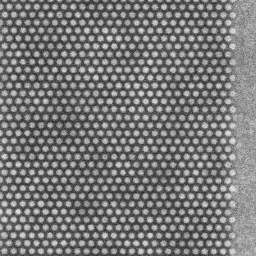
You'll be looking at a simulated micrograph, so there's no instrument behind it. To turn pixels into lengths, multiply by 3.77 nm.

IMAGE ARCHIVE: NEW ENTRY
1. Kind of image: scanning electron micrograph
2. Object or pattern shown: a regular array of raised bodies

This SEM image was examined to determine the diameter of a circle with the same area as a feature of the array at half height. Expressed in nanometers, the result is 22.1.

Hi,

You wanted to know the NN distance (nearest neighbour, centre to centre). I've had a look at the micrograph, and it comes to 33 nm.